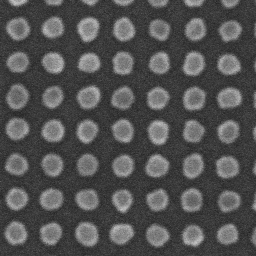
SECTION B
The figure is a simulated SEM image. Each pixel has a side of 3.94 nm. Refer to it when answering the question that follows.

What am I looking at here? a regular array of raised bodies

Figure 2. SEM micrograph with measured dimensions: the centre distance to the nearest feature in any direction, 133 nm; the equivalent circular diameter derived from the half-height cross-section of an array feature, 76.7 nanometres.